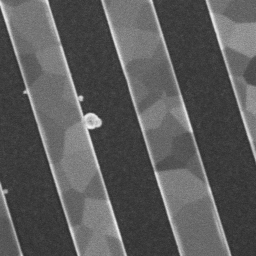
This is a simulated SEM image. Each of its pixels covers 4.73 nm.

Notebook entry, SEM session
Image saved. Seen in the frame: one or a few lines or trenches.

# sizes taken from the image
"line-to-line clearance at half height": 245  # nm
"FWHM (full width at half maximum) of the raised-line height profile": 0.226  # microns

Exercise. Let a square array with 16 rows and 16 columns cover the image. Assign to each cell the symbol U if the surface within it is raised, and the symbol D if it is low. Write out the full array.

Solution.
UUUDDDDUUUDDDUUU
UUUDDDDUUUDDDUUU
DUUUDDDUUUDDDDUU
DUUUDDDUUUUDDDUU
DUUUDDDDUUUDDDUU
DDUUUDDDUUUDDDDU
DDUUUDDDUUUDDDDU
DDUUUUDDDUUUDDDU
DDDUUUDDDUUUDDDD
DDDUUUDDDUUUDDDD
DDDUUUDDDDUUUDDD
DDDDUUUDDDUUUDDD
DDDDUUUDDDUUUDDD
UDDDUUUDDDDUUUDD
UDDDUUUDDDDUUUDD
UDDDDUUUDDDUUUDD